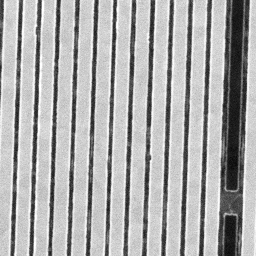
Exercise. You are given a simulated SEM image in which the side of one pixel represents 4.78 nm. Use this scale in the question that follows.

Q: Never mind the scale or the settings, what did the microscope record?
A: parallel lines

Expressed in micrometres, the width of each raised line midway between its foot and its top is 0.0633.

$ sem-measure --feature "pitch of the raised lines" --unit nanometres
90.2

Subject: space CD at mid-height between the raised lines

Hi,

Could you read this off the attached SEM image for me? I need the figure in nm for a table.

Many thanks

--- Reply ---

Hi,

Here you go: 26.9